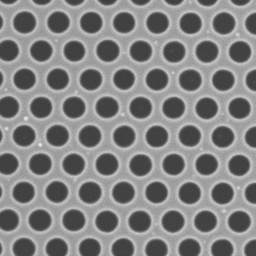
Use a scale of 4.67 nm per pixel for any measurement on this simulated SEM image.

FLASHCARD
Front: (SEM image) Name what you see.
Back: a regular array of holes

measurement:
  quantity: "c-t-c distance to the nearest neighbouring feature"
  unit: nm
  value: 152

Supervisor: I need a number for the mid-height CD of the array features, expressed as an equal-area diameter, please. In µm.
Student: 0.0994